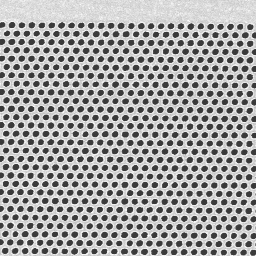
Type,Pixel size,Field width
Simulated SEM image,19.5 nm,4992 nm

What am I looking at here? a regular array of holes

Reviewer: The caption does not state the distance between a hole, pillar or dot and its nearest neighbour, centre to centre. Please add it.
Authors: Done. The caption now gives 9.5 px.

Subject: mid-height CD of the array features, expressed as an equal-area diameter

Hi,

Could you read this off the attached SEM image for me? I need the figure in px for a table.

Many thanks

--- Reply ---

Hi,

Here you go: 6.38